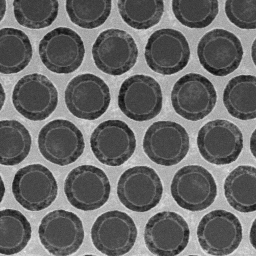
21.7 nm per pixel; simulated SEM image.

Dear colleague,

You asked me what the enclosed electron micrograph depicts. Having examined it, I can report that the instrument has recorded a regular array of ring-shaped grooves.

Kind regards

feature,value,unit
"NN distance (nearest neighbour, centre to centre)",1130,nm